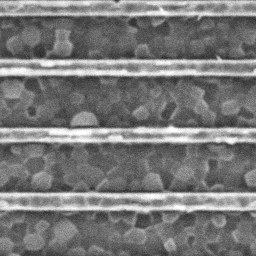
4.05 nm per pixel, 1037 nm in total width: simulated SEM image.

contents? one or a few lines or trenches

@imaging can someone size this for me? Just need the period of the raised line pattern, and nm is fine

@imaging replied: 261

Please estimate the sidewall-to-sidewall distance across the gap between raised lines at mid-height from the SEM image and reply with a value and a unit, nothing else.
214 nanometres